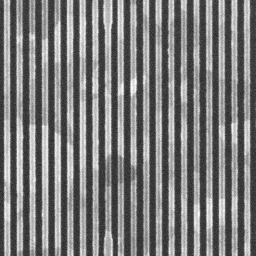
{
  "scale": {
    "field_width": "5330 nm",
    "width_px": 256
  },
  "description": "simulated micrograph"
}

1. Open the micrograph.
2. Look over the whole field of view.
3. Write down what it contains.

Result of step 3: parallel lines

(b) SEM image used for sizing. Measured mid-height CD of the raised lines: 0.107 um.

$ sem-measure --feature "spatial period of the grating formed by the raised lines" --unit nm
263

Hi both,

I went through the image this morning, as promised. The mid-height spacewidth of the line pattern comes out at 0.156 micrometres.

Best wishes